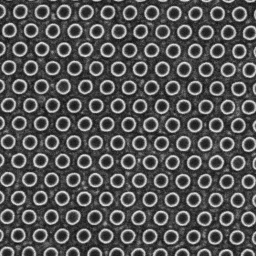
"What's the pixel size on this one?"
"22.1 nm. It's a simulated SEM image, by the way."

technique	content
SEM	a regular array of raised bodies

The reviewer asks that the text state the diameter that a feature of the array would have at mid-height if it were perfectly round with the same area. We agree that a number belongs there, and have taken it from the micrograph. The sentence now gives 297 nm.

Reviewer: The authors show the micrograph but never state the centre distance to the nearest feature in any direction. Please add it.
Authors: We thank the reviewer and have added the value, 468 nm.